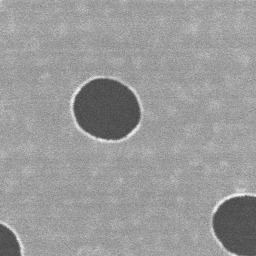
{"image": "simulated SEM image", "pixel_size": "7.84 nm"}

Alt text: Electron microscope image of holes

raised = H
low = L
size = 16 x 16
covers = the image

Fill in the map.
HHHHHHHHHHHHHHHH
HHHHHHHHHHHHHHHH
HHHHHHHHHHHHHHHH
HHHHHHHHHHHHHHHH
HHHHHHHHHHHHHHHH
HHHHHLLLHHHHHHHH
HHHHHLLLLHHHHHHH
HHHHHLLLLHHHHHHH
HHHHHHLLHHHHHHHH
HHHHHHHHHHHHHHHH
HHHHHHHHHHHHHHHH
HHHHHHHHHHHHHHHH
HHHHHHHHHHHHHHLL
HHHHHHHHHHHHHLLL
LHHHHHHHHHHHHLLL
LHHHHHHHHHHHHHLL